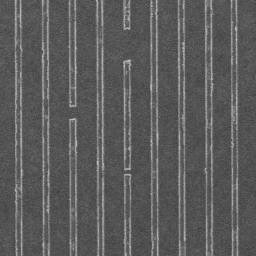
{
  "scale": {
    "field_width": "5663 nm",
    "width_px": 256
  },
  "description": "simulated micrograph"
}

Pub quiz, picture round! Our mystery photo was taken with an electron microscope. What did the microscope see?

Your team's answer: parallel lines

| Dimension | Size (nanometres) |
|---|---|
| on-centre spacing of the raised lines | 597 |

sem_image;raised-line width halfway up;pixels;6.25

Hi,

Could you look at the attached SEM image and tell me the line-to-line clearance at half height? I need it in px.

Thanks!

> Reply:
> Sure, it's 21.5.